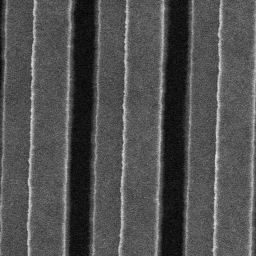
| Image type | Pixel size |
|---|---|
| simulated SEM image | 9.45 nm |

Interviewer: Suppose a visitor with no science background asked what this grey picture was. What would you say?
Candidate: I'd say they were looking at lines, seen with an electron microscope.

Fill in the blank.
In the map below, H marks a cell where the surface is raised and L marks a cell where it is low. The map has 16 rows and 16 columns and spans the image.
HHHHLLHHHHLLHHHH
HHHHLLHHHHLLHHHH
HHHHLLHHHHLLHHHH
HHHHLLHHHHLLHHHH
HHHHLLHHHHLLHHHH
HHHHLLHHHHLLHHHH
HHHHLLHHHHLLHHHH
HHHHLLHHHHLLHHHH
HHHHLLHHHHLLHHHH
HHHHLLHHHHLLHHHH
HHHHLLHHHHLLHHHH
HHHHLLHHHHLLHHHH
HHHHLLHHHHLLHHHH
HHHHLLHHHHLLHHHH
HHHHLLHHHHLLHHHH
HHHHLLHHHHLLHHHH